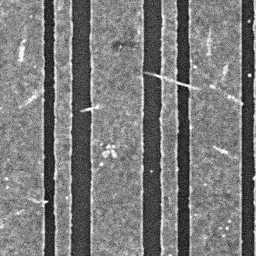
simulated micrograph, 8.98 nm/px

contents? lines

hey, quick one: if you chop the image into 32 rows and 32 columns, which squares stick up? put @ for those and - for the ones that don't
@@@@@--@@--@@@@@@@--@@--@@@@@@--
@@@@@--@@--@@@@@@@--@@--@@@@@@--
@@@@@--@@--@@@@@@@--@@--@@@@@@--
@@@@@--@@--@@@@@@@--@@--@@@@@@--
@@@@@--@@--@@@@@@@--@@--@@@@@@--
@@@@@--@@--@@@@@@@--@@--@@@@@@--
@@@@@--@@--@@@@@@@--@@--@@@@@@--
@@@@@--@@--@@@@@@@--@@--@@@@@@--
@@@@@--@@--@@@@@@@--@@--@@@@@@--
@@@@@--@@--@@@@@@@--@@--@@@@@@--
@@@@@--@@--@@@@@@@--@@--@@@@@@--
@@@@@--@@--@@@@@@@--@@--@@@@@@--
@@@@@--@@--@@@@@@@--@@--@@@@@@--
@@@@@--@@--@@@@@@@--@@--@@@@@@--
@@@@@--@@---@@@@@@--@@--@@@@@@--
@@@@@--@@--@@@@@@@--@@--@@@@@@--
@@@@@--@@--@@@@@@@--@@--@@@@@@--
@@@@@--@@--@@@@@@@--@@--@@@@@@--
@@@@@--@@--@@@@@@@--@@--@@@@@@--
@@@@@--@@--@@@@@@@--@@--@@@@@@--
@@@@@--@@--@@@@@@@--@@--@@@@@@--
@@@@@--@@---@@@@@@--@@--@@@@@@--
@@@@@--@@---@@@@@@--@@--@@@@@@--
@@@@@--@@--@@@@@@@--@@--@@@@@@--
@@@@@--@@--@@@@@@@--@@--@@@@@@--
@@@@@@-@@--@@@@@@@--@@--@@@@@@--
@@@@@--@@--@@@@@@@--@@--@@@@@@--
@@@@@--@@--@@@@@@@--@@--@@@@@@--
@@@@@--@@--@@@@@@@--@@--@@@@@@--
@@@@@--@@--@@@@@@@--@@--@@@@@@--
@@@@@--@@--@@@@@@@--@@--@@@@@@--
@@@@@--@@--@@@@@@@--@@--@@@@@@--